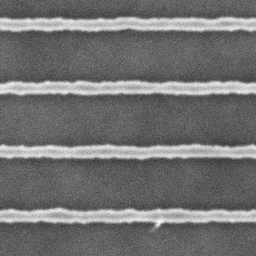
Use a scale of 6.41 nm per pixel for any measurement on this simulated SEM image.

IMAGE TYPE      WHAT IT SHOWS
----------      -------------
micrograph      lines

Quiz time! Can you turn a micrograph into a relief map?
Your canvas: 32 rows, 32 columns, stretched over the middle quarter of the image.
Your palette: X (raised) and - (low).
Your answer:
--------------------------------
--------------------------------
--------------------------------
--------------------------------
---XXX--------X-XXX-------------
XXXXXXXXXXXXXXXXXXXXXXXXXXXXXXXX
XXXXXXXXXXXXXXXXXXXXXXXXXXXXXXXX
--------------------------------
--------------------------------
--------------------------------
--------------------------------
--------------------------------
--------------------------------
--------------------------------
--------------------------------
--------------------------------
--------------------------------
--------------------------------
--------------------------------
--------------------------------
----------XX-------------------X
XXXXXXXXXXXXXXXXXXXXXXXXXXXXXXXX
XXXXXXXXXXXXXXXXXXXXXXXXXXXXXXXX
------------------XXX-----------
--------------------------------
--------------------------------
--------------------------------
--------------------------------
--------------------------------
--------------------------------
--------------------------------
--------------------------------